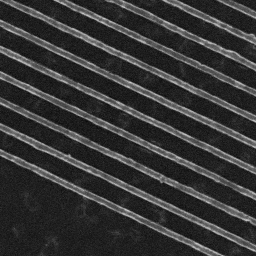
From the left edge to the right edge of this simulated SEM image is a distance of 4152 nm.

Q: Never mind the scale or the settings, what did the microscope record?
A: parallel lines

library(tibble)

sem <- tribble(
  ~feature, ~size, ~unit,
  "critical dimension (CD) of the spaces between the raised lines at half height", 0.297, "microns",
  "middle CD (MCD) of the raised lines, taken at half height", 86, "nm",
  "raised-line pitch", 380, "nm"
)